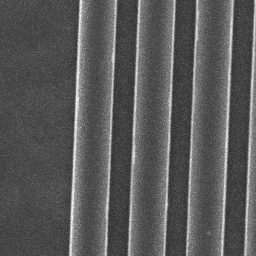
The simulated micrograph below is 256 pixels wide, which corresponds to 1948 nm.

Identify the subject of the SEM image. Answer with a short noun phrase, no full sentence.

parallel lines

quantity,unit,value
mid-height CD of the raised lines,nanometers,271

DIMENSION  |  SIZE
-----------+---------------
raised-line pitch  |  442 nanometres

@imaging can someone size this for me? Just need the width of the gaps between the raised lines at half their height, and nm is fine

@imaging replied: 168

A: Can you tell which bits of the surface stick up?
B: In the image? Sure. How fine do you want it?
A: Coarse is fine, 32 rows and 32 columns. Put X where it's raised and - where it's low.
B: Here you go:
----------XXXX---XXXXX---XXXX---
----------XXXX---XXXXX---XXXX---
----------XXXX---XXXXX---XXXX---
----------XXXX---XXXXX---XXXX---
----------XXXX---XXXXX--XXXXX---
----------XXXX---XXXXX--XXXXX---
----------XXXX---XXXXX--XXXXX---
----------XXXX---XXXXX--XXXXX---
----------XXXX---XXXX---XXXXX---
----------XXXX---XXXX---XXXXX---
----------XXXX---XXXX---XXXXX--X
----------XXXX---XXXX---XXXXX--X
----------XXXX---XXXX---XXXXX--X
----------XXXX---XXXX---XXXXX--X
----------XXXX---XXXX---XXXXX--X
----------XXXX---XXXX---XXXX---X
---------XXXXX---XXXX---XXXX---X
---------XXXXX---XXXX---XXXX---X
---------XXXXX---XXXX---XXXX---X
---------XXXXX---XXXX---XXXX---X
---------XXXXX---XXXX---XXXX---X
---------XXXXX---XXXX---XXXX---X
---------XXXXX---XXXX---XXXX---X
---------XXXXX---XXXX---XXXX---X
---------XXXXX--XXXXX---XXXX---X
---------XXXX---XXXXX---XXXX---X
---------XXXX---XXXXX---XXXX---X
---------XXXX---XXXXX---XXXX---X
---------XXXX---XXXXX---XXXX---X
---------XXXX---XXXXX--XXXXX---X
---------XXXX---XXXXX--XXXXX---X
---------XXXX---XXXXX--XXXXX---X